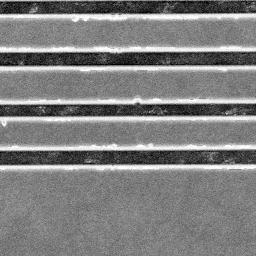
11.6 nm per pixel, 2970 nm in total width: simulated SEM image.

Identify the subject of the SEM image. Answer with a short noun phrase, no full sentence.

parallel lines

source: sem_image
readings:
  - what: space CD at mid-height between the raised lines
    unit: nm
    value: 212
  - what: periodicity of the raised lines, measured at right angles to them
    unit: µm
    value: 0.582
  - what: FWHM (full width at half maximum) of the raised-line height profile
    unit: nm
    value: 393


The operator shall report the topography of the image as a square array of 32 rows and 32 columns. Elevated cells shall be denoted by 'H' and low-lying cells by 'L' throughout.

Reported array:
LLLLLLLLLLLLLLLLLLLLLLLLLLLLLLLL
LLLLLLLLLLLLLLLLLLLLLLLLLLLLLLLL
HHHHHHHHHHHHHHHHHHHHHHHHHHHHHHHH
HHHHHHHHHHHHHHHHHHHHHHHHHHHHHHHH
HHHHHHHHHHHHHHHHHHHHHHHHHHHHHHHH
HHHHHHHHHHHHHHHHHHHHHHHHHHHHHHHH
LLLLLLLLLLLLLLLLLLLLLLLLLLLLLLLL
LLLLLLLLLLLLLLLLLLLLLLLLLLLLLLLL
LLLLLLLLLLLLLLLLLLLLLLLLLLLLLLLL
HHHHHHHHHHHHHHHHHHHHHHHHHHHHHHHH
HHHHHHHHHHHHHHHHHHHHHHHHHHHHHHHH
HHHHHHHHHHHHHHHHHHHHHHHHHHHHHHHH
HHHHHHHHHHHHHHHHHHHHHHHHHHHHHHHH
LLLLLLLLLLLLLLLLLLLLLLLLLLLLLLLL
LLLLLLLLLLLLLLLLLLLLLLLLLLLLLLLL
HHHHHHHHHHHHHHHHHHHHHHHHHHHHHHHH
HHHHHHHHHHHHHHHHHHHHHHHHHHHHHHHH
HHHHHHHHHHHHHHHHHHHHHHHHHHHHHHHH
HHHHHHHHHHHHLLLLLLLLLLLLLLLLLLLL
LLLLLLLLLLLLLLLLLLLLLLLLLLLLLLLL
LLLLLLLLLLLLLLLLLLLLLLLLLLLLLLLL
HHHHHHHHHHHHHHHHHHHHHHHHHHHHHHHH
HHHHHHHHHHHHHHHHHHHHHHHHHHHHHHHH
HHHHHHHHHHHHHHHHHHHHHHHHHHHHHHHH
HHHHHHHHHHHHHHHHHHHHHHHHHHHHHHHH
HHHHHHHHHHHHHHHHHHHHHHHHHHHHHHHH
HHHHHHHHHHHHHHHHHHHHHHHHHHHHHHHH
HHHHHHHHHHHHHHHHHHHHHHHHHHHHHHHH
HHHHHHHHHHHHHHHHHHHHHHHHHHHHHHHH
HHHHHHHHHHHHHHHHHHHHHHHHHHHHHHHH
HHHHHHHHHHHHHHHHHHHHHHHHHHHHHHHH
HHHHHHHHHHHHHHHHHHHHHHHHHHHHHHHH